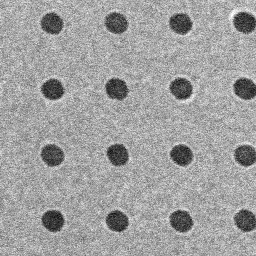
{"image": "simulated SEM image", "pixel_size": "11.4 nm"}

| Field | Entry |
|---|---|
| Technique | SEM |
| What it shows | a regular array of holes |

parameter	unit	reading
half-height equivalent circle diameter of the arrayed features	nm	275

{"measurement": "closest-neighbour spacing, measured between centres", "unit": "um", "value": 0.729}